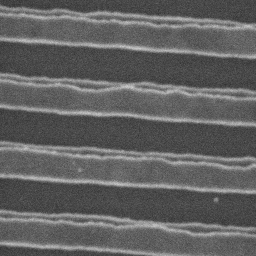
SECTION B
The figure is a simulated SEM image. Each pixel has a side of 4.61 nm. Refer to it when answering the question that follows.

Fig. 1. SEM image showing lines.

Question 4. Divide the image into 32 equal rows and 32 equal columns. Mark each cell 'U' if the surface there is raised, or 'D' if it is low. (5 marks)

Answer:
DDDDDDDDDDDDDDDDDDDDDDDDDDDDDDDD
UUUUUUUUUDDDDDDDDDDDDDDDDDDDDDDD
UUUUUUUUUUUUUUUUUUUUUUUUDDDDDDDD
UUUUUUUUUUUUUUUUUUUUUUUUUUUUUUUU
UUUUUUUUUUUUUUUUUUUUUUUUUUUUUUUU
DDDDDDDDUUUUUUUUUUUUUUUUUUUUUUUU
DDDDDDDDDDDDDDDDDDDDDDUUUUUUUUUU
DDDDDDDDDDDDDDDDDDDDDDDDDDDDDDDD
DDDDDDDDDDDDDDDDDDDDDDDDDDDDDDDD
UUDDDDDDDDDDDDDDDDDDDDDDDDDDDDDD
UUUUUUUUUUUUUUDDDUUDDDDDDDDDDDDD
UUUUUUUUUUUUUUUUUUUUUUUUUUUUUUUU
UUUUUUUUUUUUUUUUUUUUUUUUUUUUUUUU
DDUUUUUUUUUUUUUUUUUUUUUUUUUUUUUU
DDDDDDDDDDDDDDDDUUUUUUUUUUUUUUUU
DDDDDDDDDDDDDDDDDDDDDDDDDDDDDUUU
DDDDDDDDDDDDDDDDDDDDDDDDDDDDDDDD
DDDDDDDDDDDDDDDDDDDDDDDDDDDDDDDD
UUUUUUUDDDDDDDDDDDDDDDDDDDDDDDDD
UUUUUUUUUUUUUUUUUUUUUUUUUDDDDDDD
UUUUUUUUUUUUUUUUUUUUUUUUUUUUUUUU
UUUUUUUUUUUUUUUUUUUUUUUUUUUUUUUU
DDDDDDUUUUUUUUUUUUUUUUUUUUUUUUUU
DDDDDDDDDDDDDDDDDDDDDDUUUUUUUUUU
DDDDDDDDDDDDDDDDDDDDDDDDDDDDDDDD
DDDDDDDDDDDDDDDDDDDDDDDDDDDDDDDD
UDDDDDDDDDDDDDDDDDDDDDDDDDDDDDDD
UUUUUUUUUUUUUUUUDDDDDDDDDDDDDDDD
UUUUUUUUUUUUUUUUUUUUUUUUUUUUUUDD
UUUUUUUUUUUUUUUUUUUUUUUUUUUUUUUU
DUUUUUUUUUUUUUUUUUUUUUUUUUUUUUUU
DDDDDDDDDDDDDDDUUUUUUUUUUUUUUUUU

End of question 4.